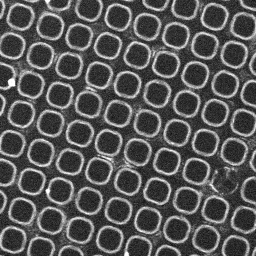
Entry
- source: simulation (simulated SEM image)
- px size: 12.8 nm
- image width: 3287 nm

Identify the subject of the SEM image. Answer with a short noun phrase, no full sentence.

a regular array of raised bodies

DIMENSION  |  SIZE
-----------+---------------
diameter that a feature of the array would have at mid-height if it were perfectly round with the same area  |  329 nanometers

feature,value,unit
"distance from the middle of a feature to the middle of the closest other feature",30.2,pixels